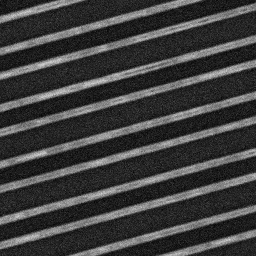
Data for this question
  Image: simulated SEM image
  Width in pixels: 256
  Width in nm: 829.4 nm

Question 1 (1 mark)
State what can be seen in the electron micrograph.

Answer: parallel lines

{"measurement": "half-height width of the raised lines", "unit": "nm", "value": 21.1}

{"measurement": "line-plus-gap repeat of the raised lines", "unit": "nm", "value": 88.2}